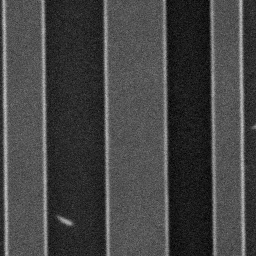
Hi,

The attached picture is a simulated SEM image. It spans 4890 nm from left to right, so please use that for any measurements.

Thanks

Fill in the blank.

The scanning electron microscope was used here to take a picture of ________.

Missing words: groups of lines, slits or small figures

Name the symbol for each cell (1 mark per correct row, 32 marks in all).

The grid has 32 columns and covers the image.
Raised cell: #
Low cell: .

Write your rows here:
#####........########......###..
.####........########......###..
.####........########......###..
.####........########......###..
.####........########......###..
.####........########......###..
.####........########......###..
.####........########......###..
.####........########......###..
.####........########......###..
.####........########......###..
.####........########......###..
.####........########......###..
.####........########......###..
.####........########......###..
.#####.......########......###..
.#####.......########......###..
.#####.......########......###..
.#####.......########......###..
.#####.......########......###..
.#####.......########......###..
.#####.......########......###..
.#####.......########......###..
.#####.......########......###..
.#####.......########......###..
.#####.......########......###..
.#####.......########......###..
.#####.......########......###..
.#####.......########......###..
.#####.......########......###..
.#####.......########......###..
.#####.......########......###..